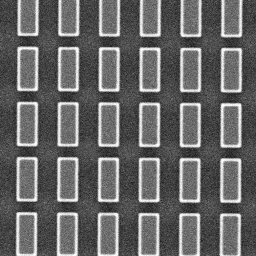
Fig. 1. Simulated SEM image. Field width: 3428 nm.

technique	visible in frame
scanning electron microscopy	groups of lines, slits or small figures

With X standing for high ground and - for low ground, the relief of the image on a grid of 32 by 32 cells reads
--XXX--XXX---XX---XX---XX---XX--
--XXX--XXX---XX---XX---XX---XX--
--XXX--XXX---XX---XX---XX---XX--
--XXX--XXX---XX---XX---XX---XX--
----------------------------XX--
--------------------------------
--XXX--XXX---XX---XX---XX---XX--
--XXX--XXX---XX---XX---XX---XX--
--XXX--XXX---XX---XX---XX---XX--
--XXX--XXX---XX---XX---XX---XX--
--XXX--XXX---XX---XX---XX---XX--
--------------------------------
--------------------------------
--XXX--XXX---XX---XX---XX---XX--
--XXX--XXX---XX---XX---XX---XX--
--XXX--XXX---XX---XX---XX---XX--
--XXX--XXX---XX---XX---XX---XX--
--XXX--XXX---XX---XX---XX---XX--
--------------------------------
--------------------------------
--XXX--XXX---XX---XX---XX---XX--
--XXX--XXX--XXX---XX---XX---XX--
--XXX--XXX--XXX---XX---XX---XX--
--XXX--XXX--XXX---XX---XX---XX--
--XX---XXX--XXX---XX---XX---XX--
--------------------------------
--------------------------------
--XX---XXX--XXX--XXX---XX---XX--
--XX---XXX--XXX--XXX---XX---XX--
--XX---XXX--XXX--XXX---XX---XX--
--XX---XX---XXX--XXX---XX---XX--
--XX---XX---XXX--XXX---XX---XX--